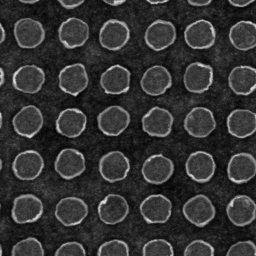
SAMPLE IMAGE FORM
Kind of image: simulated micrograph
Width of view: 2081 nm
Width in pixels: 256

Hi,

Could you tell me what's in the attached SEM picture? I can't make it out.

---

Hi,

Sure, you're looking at a regular array of raised bodies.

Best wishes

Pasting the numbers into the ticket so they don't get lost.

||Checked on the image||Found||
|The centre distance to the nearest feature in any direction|341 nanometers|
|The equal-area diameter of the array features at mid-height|239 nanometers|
